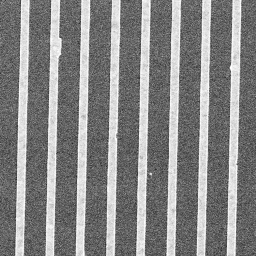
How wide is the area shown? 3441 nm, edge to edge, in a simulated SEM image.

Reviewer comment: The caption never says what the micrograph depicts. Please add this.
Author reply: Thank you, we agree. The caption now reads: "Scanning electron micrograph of parallel lines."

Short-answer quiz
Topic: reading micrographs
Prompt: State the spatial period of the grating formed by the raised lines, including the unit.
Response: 406 nanometres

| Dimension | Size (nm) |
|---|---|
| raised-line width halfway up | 104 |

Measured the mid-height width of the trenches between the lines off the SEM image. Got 301 nanometres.